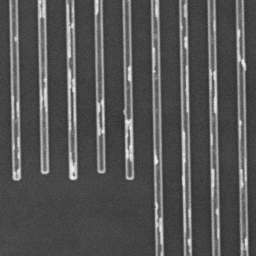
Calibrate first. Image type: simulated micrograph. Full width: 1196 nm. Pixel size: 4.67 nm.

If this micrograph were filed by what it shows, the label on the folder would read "parallel lines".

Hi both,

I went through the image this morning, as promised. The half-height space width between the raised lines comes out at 102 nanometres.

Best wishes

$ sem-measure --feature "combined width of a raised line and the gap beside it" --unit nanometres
132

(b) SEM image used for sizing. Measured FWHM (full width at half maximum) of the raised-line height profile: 6.62 pixels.